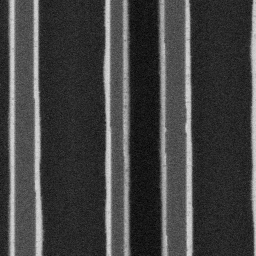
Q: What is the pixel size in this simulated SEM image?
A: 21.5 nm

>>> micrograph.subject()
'lines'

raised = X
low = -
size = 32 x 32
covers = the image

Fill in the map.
--XX----------XX----XXX---------
--XX----------XX----XXX---------
--XX----------XX----XXX---------
--XX----------XX----XXX---------
--XX----------XX----XXX---------
--XX----------XX----XXX---------
--XX----------XX----XXX---------
--XX----------XX----XXX---------
--XX----------XX----XXX---------
--XX----------XX----XXX---------
--XX----------XX----XXX---------
--XX----------XX----XXX---------
--XX----------XX----XXX---------
--XX----------XX----XXX---------
--XX----------XX----XXX---------
--XX----------XX-----XX---------
--XX----------XX-----XX---------
--XX----------XX-----XX---------
--XX----------XX-----XX---------
--XX----------XX-----XX---------
--XX----------XX-----XX---------
--XX----------XX-----XX---------
--XX----------XX-----XX---------
--XX----------XX-----XX---------
--XXX---------XX-----XX---------
--XXX---------XX-----XX---------
--XXX---------XX-----XX---------
--XXX---------XX-----XX---------
--XXX---------XX-----XXX--------
--XXX---------XX-----XXX--------
--XXX---------XX-----XXX--------
--XXX---------XX-----XXX--------